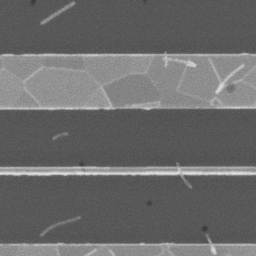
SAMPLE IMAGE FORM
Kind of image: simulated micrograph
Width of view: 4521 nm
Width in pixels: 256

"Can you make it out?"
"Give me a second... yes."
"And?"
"lines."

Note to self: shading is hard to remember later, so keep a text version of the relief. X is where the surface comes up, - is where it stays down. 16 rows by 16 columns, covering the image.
----------------
----------------
----------------
XXXXXXXXXXXXXXXX
XXXXXXXXXXXXXXXX
XXXXXXXXXXXXXXXX
XXXXXXXXXXXXXXXX
----------------
----------------
----------------
----------------
----------------
----------------
----------------
----------------
XXXXXXXXXXXXXXXX